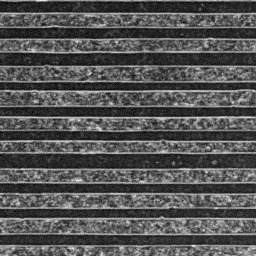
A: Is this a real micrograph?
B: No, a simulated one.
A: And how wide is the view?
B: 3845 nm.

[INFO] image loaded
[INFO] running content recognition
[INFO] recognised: parallel lines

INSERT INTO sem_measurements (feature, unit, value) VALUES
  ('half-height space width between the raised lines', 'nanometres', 161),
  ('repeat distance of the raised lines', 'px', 25.7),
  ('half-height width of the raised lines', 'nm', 210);